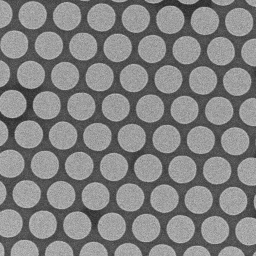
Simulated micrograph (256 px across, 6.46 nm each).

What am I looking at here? an array of small figures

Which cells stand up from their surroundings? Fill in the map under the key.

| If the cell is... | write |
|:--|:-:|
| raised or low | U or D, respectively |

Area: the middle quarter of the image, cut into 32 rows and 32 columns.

UUUDDDDUUUUDDDDDUUUDDDDDDUUDDDDD
UUUDDDUUUUUUDDDUUUUUDDDDUUUUUDDD
UUUUDDUUUUUUDDUUUUUUUDDUUUUUUDDD
UUUUDDUUUUUUDDUUUUUUUDDUUUUUUDDU
UUUDDDUUUUUUDDUUUUUUUDDUUUUUUDDU
UUUDDDUUUUUUDDDUUUUUDDDUUUUUUDDD
DDDDDDDDUUDDDDDDUUUDDDDDUUUUDDDD
DDDUUUDDDDDDUDDDDDDDDDDDDDDDDDDD
DDUUUUUDDDUUUUUDDDDUUUUUDDDDUUUU
DUUUUUUUDDUUUUUUDDUUUUUUUDDUUUUU
DUUUUUUUDDUUUUUUDDUUUUUUUDDUUUUU
DUUUUUUUDDUUUUUUDDUUUUUUUDDUUUUU
DUUUUUUDDDUUUUUUDDUUUUUUUDDUUUUU
DDDUUUDDDDDUUUUDDDDUUUUUDDDUUUUU
DDDDDDDDDDDDDDDDDDDDDUDDDDDDDUUU
UUDDDDUUUUUDDDDUUUUDDDDDDUUDDDDD
UUUDDUUUUUUDDDUUUUUUDDDUUUUUDDDD
UUUDDUUUUUUUDDUUUUUUDDDUUUUUUDDU
UUUDDUUUUUUUDDUUUUUUDDUUUUUUUDDU
UUUDDUUUUUUUDDUUUUUUDDUUUUUUUDDU
UUDDDDUUUUUDDDUUUUUUDDDUUUUUUDDU
DDDDDDDUUUDDDDDUUUUDDDDUUUUUDDDD
DDUUUDDDDDDUUDDDDDDDDDDDDDDDDDDD
DUUUUUUDDDUUUUUDDDDUUUUDDDDDUUUU
UUUUUUUDDUUUUUUUDDUUUUUUDDDUUUUU
UUUUUUUDDUUUUUUUDDUUUUUUDDUUUUUU
UUUUUUUDDUUUUUUUDDUUUUUUDDUUUUUU
DUUUUUUDDDUUUUUDDDUUUUUUDDUUUUUU
DDUUUDDDDDUUUUDDDDDUUUUDDDDUUUUU
DDDDDDDDDDDDDDDDDDDDDDDDDDDDUUUD
UUDDDDUUUUDDDDDUUUDDDDDDUUDDDDDD
UUDDDUUUUUUDDDUUUUUDDDUUUUUUDDDU